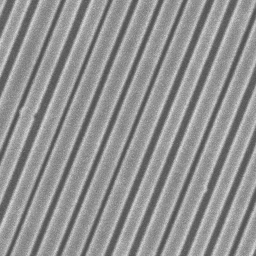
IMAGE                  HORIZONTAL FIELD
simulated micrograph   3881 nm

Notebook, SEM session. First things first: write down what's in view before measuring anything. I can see parallel lines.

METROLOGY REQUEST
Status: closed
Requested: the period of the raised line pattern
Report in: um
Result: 0.349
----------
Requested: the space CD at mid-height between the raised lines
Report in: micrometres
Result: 0.109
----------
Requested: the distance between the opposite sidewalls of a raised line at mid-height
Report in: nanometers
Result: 248